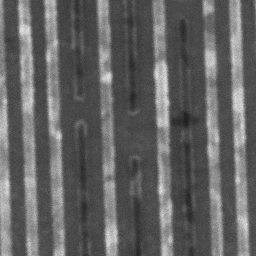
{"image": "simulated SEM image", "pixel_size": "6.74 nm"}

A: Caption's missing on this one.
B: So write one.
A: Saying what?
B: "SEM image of parallel lines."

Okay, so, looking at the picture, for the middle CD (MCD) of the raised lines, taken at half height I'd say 62.3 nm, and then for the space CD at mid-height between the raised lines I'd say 113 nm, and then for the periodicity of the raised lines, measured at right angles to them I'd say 177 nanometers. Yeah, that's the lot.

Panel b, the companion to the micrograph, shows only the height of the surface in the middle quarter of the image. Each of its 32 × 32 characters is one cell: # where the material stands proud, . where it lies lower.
...##....##.....##.....###...##.
...##....##.....##.....###...##.
...##....###....##.....###...##.
...##....###....##.....###...##.
...##....###....##.....###...##.
...##.....##....##.....###...##.
...##....###....##.....###...##.
...##....###....##.....###...##.
...##.....##....##.....###...##.
.........###....##.....###...##.
.........###....##.....###...###
..........##....##.....###...###
..........##...........###....##
..........##...........###....##
...##.....##...........###....##
...##.....##............##....##
...##.....##............##...###
...###....##............##....##
...##.....##............##....##
...##.....##............##...###
...##.....##............##....##
...##.....##............##....##
...##.....##............##...###
...###....##....##......##....##
...###....##....###.....##....##
....##....##.....##.....##....##
....##....##.....##.....##....##
....##....##.....##.....##....##
....##....##.....##.....##....##
....##....##.....##.....##....##
....##....##.....##.....##....##
....##....###....##.....##....##